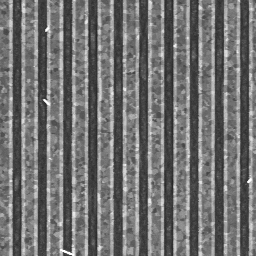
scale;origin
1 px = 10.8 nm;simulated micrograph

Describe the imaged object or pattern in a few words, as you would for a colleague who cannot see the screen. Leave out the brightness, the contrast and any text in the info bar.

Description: parallel lines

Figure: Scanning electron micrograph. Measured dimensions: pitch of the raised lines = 25.3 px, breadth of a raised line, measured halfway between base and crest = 141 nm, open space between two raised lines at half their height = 130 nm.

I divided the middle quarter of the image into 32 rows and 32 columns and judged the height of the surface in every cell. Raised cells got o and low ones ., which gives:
..oooo...ooo...ooo...oooo...ooo.
..oooo...ooo...ooo...oooo...ooo.
..oooo...ooo...ooo...oooo...ooo.
..oooo...ooo...ooo...oooo...ooo.
..oooo...ooo...ooo...oooo...ooo.
..oooo...ooo...ooo...ooo....ooo.
..oooo...ooo...ooo...oooo...ooo.
..oooo...ooo...ooo...oooo...ooo.
..oooo...ooo...ooo...oooo...ooo.
..oooo...ooo...ooo...oooo...ooo.
..oooo...ooo...ooo...oooo...ooo.
..oooo...ooo...ooo...oooo...ooo.
..oooo...ooo...ooo...oooo...ooo.
..oooo...ooo...ooo...oooo...ooo.
..oooo...ooo...ooo...oooo...ooo.
..oooo...ooo...ooo...oooo...ooo.
..oooo...ooo...ooo...oooo...ooo.
..oooo...ooo...ooo...oooo...ooo.
..oooo...ooo...ooo...oooo...ooo.
..oooo...ooo...ooo...oooo...ooo.
..oooo...ooo...ooo...ooo....ooo.
..ooo....ooo...ooo...oooo...ooo.
..oooo...ooo...ooo...oooo...ooo.
..oooo...ooo...ooo...oooo...ooo.
..oooo...ooo...ooo...oooo...ooo.
..oooo...ooo...ooo...oooo...ooo.
..oooo...ooo...ooo...oooo...ooo.
..oooo...ooo...ooo...oooo...ooo.
..oooo...ooo...ooo...oooo...ooo.
..oooo...ooo...ooo...oooo...ooo.
..oooo...ooo...ooo...oooo...ooo.
..oooo...ooo...ooo...oooo...ooo.